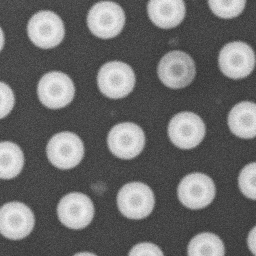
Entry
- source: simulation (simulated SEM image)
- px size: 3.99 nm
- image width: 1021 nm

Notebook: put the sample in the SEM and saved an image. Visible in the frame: an array of small figures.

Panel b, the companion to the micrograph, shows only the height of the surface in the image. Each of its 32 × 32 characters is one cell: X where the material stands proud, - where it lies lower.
------------XXX----XXXX---XXXXX-
-----X-----XXXX---XXXXX----XXX--
----XXXX---XXXXX---XXXX---------
---XXXXX---XXXX-----X-----------
----XXXX----XX------------------
----XXX----------------------XX-
---------------------XX-----XXXX
--------------------XXXX---XXXXX
-------------XXX----XXXX---XXXXX
-----XXX----XXXXX---XXXX----XXX-
X----XXXX---XXXXX----XXX--------
XX---XXXX----XXX----------------
XX---XXXX-----------------------
XX----X----------------------XXX
X---------------------XXX----XXX
---------------XX----XXXX----XXX
--------------XXXX---XXXXX---XXX
------XXXX---XXXXX---XXXX-------
XX----XXXX----XXXX-----X--------
XXX---XXXX-----XX---------------
XXX----XXX---------------------X
XXX---------------------------XX
-----------------------XXX----XX
---------------XXXX---XXXXX---XX
--------XXX----XXXX---XXXXX----X
-XX----XXXXX---XXXX----XXX------
XXXX---XXXXX---XXXX-------------
XXXX----XXX---------------------
XXXX-----X----------------------
-XX---------------------XXX----X
-----------------XX-----XXXX---X
----------------XXXX---XXXXX---X